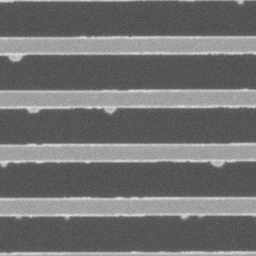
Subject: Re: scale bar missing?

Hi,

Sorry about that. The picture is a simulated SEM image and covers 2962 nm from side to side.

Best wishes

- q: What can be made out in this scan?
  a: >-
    lines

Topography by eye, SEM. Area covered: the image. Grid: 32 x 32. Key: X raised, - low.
--------------------------------
--------------------------------
--------------------------------
--------------------------------
--------------------------------
XXXXXXXXXXXXXXXXXXXXXXXXXXXXXXXX
XXXXXXXXXXXXXXXXXXXXXXXXXXXXXXXX
--------------------------------
--------------------------------
--------------------------------
--------------------------------
XXXXXXXXXXXXXXXXXXXXXXXXXXXXXXXX
XXXXXXXXXXXXXXXXXXXXXXXXXXXXXXXX
XXXX-XXXX--XX-------------------
--------------------------------
--------------------------------
--------------------------------
--------------------------------
XXXXXXXXXXXXXXXXXXXXXXXXXXXXXXXX
XXXXXXXXXXXXXXXXXXXXXXXXXXXXXXXX
--------------------------------
--------------------------------
--------------------------------
--------------------------------
--------------------------------
XXXXXXXXXXXXXXXXXXXXXXXXXXXXXXXX
XXXXXXXXXXXXXXXXXXXXXXXXXXXXXXXX
--------------------------------
--------------------------------
--------------------------------
--------------------------------
--------------------------------